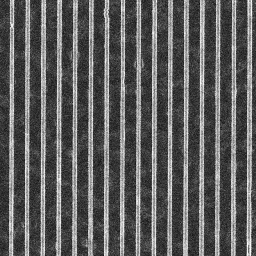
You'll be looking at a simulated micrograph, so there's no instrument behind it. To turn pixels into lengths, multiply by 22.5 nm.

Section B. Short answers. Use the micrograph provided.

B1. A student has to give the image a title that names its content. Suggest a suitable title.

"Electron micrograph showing parallel lines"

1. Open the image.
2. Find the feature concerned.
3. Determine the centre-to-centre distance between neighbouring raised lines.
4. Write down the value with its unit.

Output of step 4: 357 nanometres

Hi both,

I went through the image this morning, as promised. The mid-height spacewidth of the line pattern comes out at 273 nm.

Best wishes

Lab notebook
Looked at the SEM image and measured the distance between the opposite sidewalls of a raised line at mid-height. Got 87.3 nanometres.